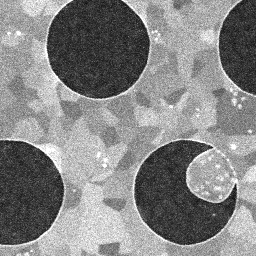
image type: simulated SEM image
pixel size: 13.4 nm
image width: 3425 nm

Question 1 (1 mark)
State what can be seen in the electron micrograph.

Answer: holes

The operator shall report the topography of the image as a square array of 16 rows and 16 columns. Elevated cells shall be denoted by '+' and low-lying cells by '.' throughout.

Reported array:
++++....+++++++.
+++......+++++..
+++......+++++..
+++......+++++..
+++......+++++..
++++....+++++++.
++++++++++++++++
++++++++++++++++
++++++++++++++++
...+++++++...+++
....+++++...++++
....++++....++++
....++++.....+.+
....+++++.....++
...+++++++....++
++++++++++++++++